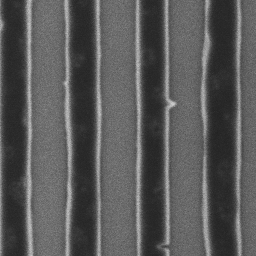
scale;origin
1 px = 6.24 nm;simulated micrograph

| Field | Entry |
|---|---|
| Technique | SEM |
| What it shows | one or a few lines or trenches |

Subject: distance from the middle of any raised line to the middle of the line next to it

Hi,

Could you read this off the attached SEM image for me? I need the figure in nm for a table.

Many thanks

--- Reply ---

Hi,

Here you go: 433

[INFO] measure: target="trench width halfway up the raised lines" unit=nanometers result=236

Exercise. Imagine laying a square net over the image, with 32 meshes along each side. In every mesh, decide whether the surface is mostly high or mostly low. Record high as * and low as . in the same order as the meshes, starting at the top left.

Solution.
****....****.....****.....****..
****....****.....****.....****..
****....****.....****.....****..
****....****.....****.....****..
****....****.....****.....****..
****....****.....****.....****..
****....****.....****.....****..
****....****.....****....*****..
****....****.....****.....****..
****....****.....****....*****..
****....****.....****....*****..
****....****.....****....*****..
****....****.....****....*****..
****....****.....****....*****..
****....****.....****.....****..
****....****.....****.....****..
****.....***.....****.....****..
****.....***.....****.....****..
****.....***.....****.....****..
****.....***.....****.....****..
****.....***.....****.....****..
****.....***.....****.....****..
****.....***.....****.....****..
****.....***.....****.....****..
****.....***.....****.....****..
****.....***.....****.....****..
****....****.....****.....****..
****....****.....****.....****..
****....****.....****.....****..
****....****.....****.....****..
****....****.....****.....****..
****....****.....****.....****..